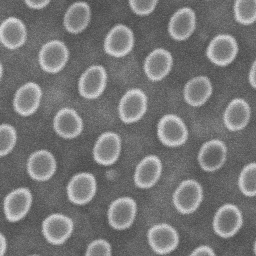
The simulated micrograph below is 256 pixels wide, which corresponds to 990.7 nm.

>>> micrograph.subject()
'a regular array of raised bodies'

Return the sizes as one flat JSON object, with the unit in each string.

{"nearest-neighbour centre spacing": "181 nanometers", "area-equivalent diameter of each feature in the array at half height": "104 nanometres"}